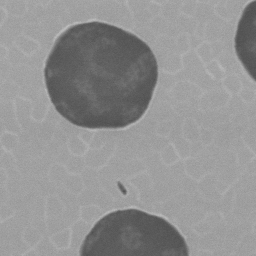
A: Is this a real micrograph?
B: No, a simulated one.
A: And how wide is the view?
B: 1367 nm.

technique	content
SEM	holes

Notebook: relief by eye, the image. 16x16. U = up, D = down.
UUUUUUUUUUUUUUUD
UUUUUDDUUUUUUUUD
UUUUDDDDDUUUUUUD
UUUDDDDDDDUUUUUD
UUUDDDDDDDUUUUUD
UUUDDDDDDDUUUUUU
UUUDDDDDDUUUUUUU
UUUUDDDDDUUUUUUU
UUUUUUUUUUUUUUUU
UUUUUUUUUUUUUUUU
UUUUUUUUUUUUUUUU
UUUUUUUUUUUUUUUU
UUUUUUUUUUUUUUUU
UUUUUUUDDDUUUUUU
UUUUUUDDDDDUUUUU
UUUUUDDDDDDDUUUU